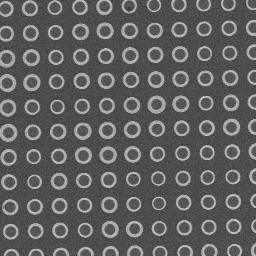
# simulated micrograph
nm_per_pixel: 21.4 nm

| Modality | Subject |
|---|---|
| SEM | an array of small figures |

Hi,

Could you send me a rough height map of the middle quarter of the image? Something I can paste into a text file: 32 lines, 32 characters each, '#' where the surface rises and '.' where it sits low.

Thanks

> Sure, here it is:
................................
................................
...##....###...###...####...###.
...###...####..####..####..####.
..####...####..####..####..####.
...###...###...###....##....##..
................................
................................
................##....###...###.
...###...###...####..####..####.
...###...####..####..####..####.
...###...###...####..####...###.
................................
................................
................##....##....###.
...###...####..####..####...###.
#..####..####..####..####...###.
...####..####..####...###...###.
...###....##....................
................................
................................
...###...####..####...###...###.
#..####..####..####...###...###.
#..####..####..####...###...###.
....##....##.....#..............
................................
................................
....##....##....###...###...###.
#..####..####...###...###...####
#..####..####...###...###...###.
....##....##....................
................................